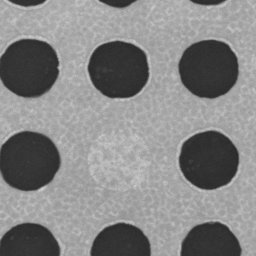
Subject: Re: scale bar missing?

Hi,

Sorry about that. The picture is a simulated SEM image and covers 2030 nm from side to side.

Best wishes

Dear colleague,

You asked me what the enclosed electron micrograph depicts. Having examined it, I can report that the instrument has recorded holes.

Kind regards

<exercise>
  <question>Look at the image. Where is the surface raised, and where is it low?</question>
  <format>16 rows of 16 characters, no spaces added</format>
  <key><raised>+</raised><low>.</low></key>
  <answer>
++++++++++++++++
++++++++++++++++
+.++++++++++++++
....++...++....+
....++...++....+
...+++...+++..++
++++++++++++++++
++++++++++++++++
+..+++++++++..++
....+++++++....+
....+++++++....+
+..+++++++++..++
++++++++++++++++
++++++++++++++++
...+++...+++..++
....++...++....+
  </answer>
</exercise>